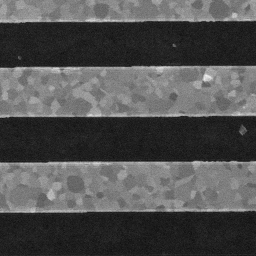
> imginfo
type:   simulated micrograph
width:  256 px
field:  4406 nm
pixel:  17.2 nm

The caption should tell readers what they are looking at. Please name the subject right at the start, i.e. lines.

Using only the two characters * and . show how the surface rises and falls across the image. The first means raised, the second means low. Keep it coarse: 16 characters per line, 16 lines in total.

****************
................
................
................
****************
****************
****************
................
................
................
****************
****************
****************
................
................
................